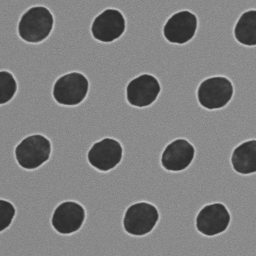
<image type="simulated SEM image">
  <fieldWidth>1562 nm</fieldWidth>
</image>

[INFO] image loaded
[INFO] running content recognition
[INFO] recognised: a regular array of holes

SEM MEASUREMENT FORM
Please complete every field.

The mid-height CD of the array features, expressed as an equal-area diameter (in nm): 197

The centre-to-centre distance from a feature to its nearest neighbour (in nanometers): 442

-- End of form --